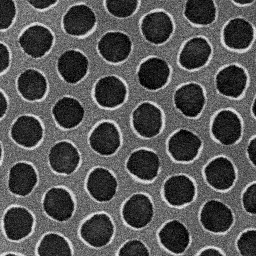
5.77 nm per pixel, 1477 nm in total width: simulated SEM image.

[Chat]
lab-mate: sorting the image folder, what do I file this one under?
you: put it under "a regular array of holes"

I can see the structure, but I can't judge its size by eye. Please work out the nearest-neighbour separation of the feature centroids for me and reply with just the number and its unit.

257 nm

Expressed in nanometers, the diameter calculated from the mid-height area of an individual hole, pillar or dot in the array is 191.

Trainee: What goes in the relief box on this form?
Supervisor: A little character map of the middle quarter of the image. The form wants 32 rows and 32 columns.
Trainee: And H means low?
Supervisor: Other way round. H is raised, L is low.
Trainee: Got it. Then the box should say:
LLLLLLHHHHHHHHHHHHHLLLLLLLHHHLLL
LLLLLLHHHHHHHHHHHHLLLLLLLLLHHHHL
LLLLLLHHHHHHHHHHHHLLLLLLLLLHHHHH
LLLLLHHHHLLLLLHHHHHLLLLLLLHHHHHH
HLLLHHHHLLLLLLLHHHHLLLLLLLHHHHHH
HHHHHHHHLLLLLLLLHHHHLLLLLHHHHLLL
HHHHHHHLLLLLLLLLHHHHHLLHHHHHLLLL
HHHHHHHLLLLLLLLLHHHHHHHHHHHHLLLL
LLHHHHHLLLLLLLLLHHHHHHHHHHHHLLLL
LLLLHHHHLLLLLLLHHHHHLHHHHHHHLLLL
LLLLLHHHHLLLLLHHHHHLLLLHHHHHLLLL
LLLLLHHHHHHHHHHHHHLLLLLLHHHHHLLL
LLLLLHHHHHHHHHHHHLLLLLLLLHHHHHLL
LLLLLHHHHHHHHHHHHLLLLLLLLHHHHHHH
LLLLHHHHHLLLHHHHHLLLLLLLLHHHHHHH
LLLHHHHHLLLLLHHHHLLLLLLLLHHHHHHH
HHHHHHHLLLLLLLHHHHLLLLLLHHHHHLLH
HHHHHHLLLLLLLLHHHHHLLLLLHHHLLLLL
HHHHHHLLLLLLLLHHHHHHHLHHHHLLLLLL
LHHHHHLLLLLLLLHHHHHHHHHHHHLLLLLL
LLLHHHHLLLLLLLHHHHHHHHHHHHLLLLLL
LLLHHHHLLLLLLHHHHHLLLHHHHHLLLLLL
LLLLHHHHHLLLHHHHHLLLLLLHHHLLLLLL
LLLLHHHHHHHHHHHHLLLLLLLLHHHLLLLL
LLLLHHHHHHHHHHHHLLLLLLLLHHHHHLLH
LLLLHHHHHHHHHHHHLLLLLLLLHHHHHHHH
LLLHHHHLLLLHHHHHLLLLLLLLHHHHHHHH
LHHHHHLLLLLLHHHHHLLLLLLLHHHHHHHH
HHHHHHLLLLLLLHHHHHLLLLLHHHLLLLLH
HHHHHHLLLLLLLHHHHHHHHHHHHLLLLLLL
HHHHHHLLLLLLLHHHHHHHHHHHHLLLLLLL
LHHHHHLLLLLLLHHHHHHHHHHHHLLLLLLL